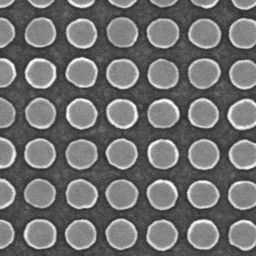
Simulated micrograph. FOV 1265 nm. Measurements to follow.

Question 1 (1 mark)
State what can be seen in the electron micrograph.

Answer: a regular array of raised bodies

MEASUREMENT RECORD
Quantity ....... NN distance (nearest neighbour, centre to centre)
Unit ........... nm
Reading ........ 197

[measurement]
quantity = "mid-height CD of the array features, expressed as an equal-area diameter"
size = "148 nanometres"